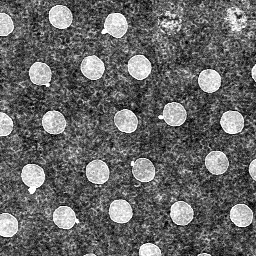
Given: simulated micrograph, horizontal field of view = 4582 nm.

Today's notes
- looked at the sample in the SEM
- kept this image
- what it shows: a regular array of raised bodies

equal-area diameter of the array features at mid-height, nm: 418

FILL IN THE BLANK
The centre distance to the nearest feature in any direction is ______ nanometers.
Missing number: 865